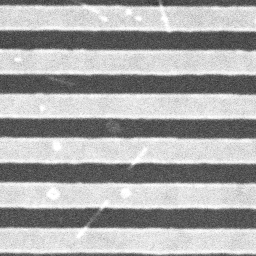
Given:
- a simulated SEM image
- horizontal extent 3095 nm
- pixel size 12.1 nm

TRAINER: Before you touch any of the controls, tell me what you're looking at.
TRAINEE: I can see lines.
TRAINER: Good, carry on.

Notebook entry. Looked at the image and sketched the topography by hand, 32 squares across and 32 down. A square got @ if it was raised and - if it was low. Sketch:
--------------------------------
@@@@@@@@@@@@@@@@@@@@@@@@@@@@@@@@
@@@@@@@@@@@@@@@@@@@@@@@@@@@@@@@@
@@@@@@@@@@@@@@@@@@@@@@@@@@@@@@@@
--------------------------------
--------------------------------
@@@@@@@@@@@@@@@@@@@@@@@@@@@@@@@@
@@@@@@@@@@@@@@@@@@@@@@@@@@@@@@@@
@@@@@@@@@@@@@@@@@@@@@@@@@@@@@@@@
--------------------------------
--------------------------------
--------------------------------
@@@@@@@@@@@@@@@@@@@@@@@@@@@@@@@@
@@@@@@@@@@@@@@@@@@@@@@@@@@@@@@@@
@@@@@@@@@@@@@@@@@@@@@@@@@@@@@@@@
--------------------------------
--------------------------------
@@@@@@@@@@@@@@@@@@@@@@@@@@@@@@@@
@@@@@@@@@@@@@@@@@@@@@@@@@@@@@@@@
@@@@@@@@@@@@@@@@@@@@@@@@@@@@@@@@
--------------------------------
--------------------------------
--------------------------------
@@@@@@@@@@@@@@@@@@@@@@@@@@@@@@@@
@@@@@@@@@@@@@@@@@@@@@@@@@@@@@@@@
@@@@@@@@@@@@@@@@@@@@@@@@@@@@@@@@
--------------------------------
--------------------------------
--------------------------------
@@@@@@@@@@@@@@@@@@@@@@@@@@@@@@@@
@@@@@@@@@@@@@@@@@@@@@@@@@@@@@@@@
@@@@@@@@@@@@@@@@@@@@@@@@@@@@@@@@